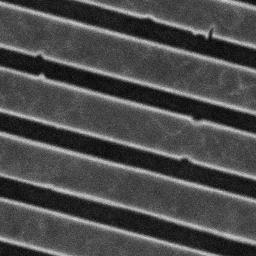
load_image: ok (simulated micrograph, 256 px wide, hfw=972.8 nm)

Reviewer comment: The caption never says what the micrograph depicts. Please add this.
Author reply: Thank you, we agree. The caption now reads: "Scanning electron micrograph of one or a few lines or trenches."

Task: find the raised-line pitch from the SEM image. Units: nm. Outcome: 238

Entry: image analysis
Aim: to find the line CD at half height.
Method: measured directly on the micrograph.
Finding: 156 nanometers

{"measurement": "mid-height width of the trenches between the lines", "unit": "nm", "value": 83.7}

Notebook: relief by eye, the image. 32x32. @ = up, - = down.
@-----------@@@@@@@@@@@@@@@@@@--
@@@@------------@@@@@@@@@@@@@@@@
@@@@@@@@-----------@@@@@@@@@@@@@
@@@@@@@@@@@@-----------@@@@@@@@@
@@@@@@@@@@@@@@@@-----------@@@@@
@@@@@@@@@@@@@@@@@@@-----------@@
---@@@@@@@@@@@@@@@@@@@@---------
------@@@@@@@@@@@@@@@@@@@@@-----
----------@@@@@@@@@@@@@@@@@@@@@-
@@@@----------@@@@@@@@@@@@@@@@@@
@@@@@@@@----------@@@@@@@@@@@@@@
@@@@@@@@@@@-----------@@@@@@@@@@
@@@@@@@@@@@@@@@-----------@@@@@@
@@@@@@@@@@@@@@@@@@@----------@@@
---@@@@@@@@@@@@@@@@@@@----------
------@@@@@@@@@@@@@@@@@@@@@-----
----------@@@@@@@@@@@@@@@@@@@@--
@@@-----------@@@@@@@@@@@@@@@@@@
@@@@@@@-----------@@@@@@@@@@@@@@
@@@@@@@@@@@----------@@@@@@@@@@@
@@@@@@@@@@@@@@-----------@@@@@@@
@@@@@@@@@@@@@@@@@@-----------@@@
---@@@@@@@@@@@@@@@@@@@----------
------@@@@@@@@@@@@@@@@@@@@------
----------@@@@@@@@@@@@@@@@@@@---
@@@-----------@@@@@@@@@@@@@@@@@@
@@@@@@------------@@@@@@@@@@@@@@
@@@@@@@@@@-----------@@@@@@@@@@@
@@@@@@@@@@@@@@-----------@@@@@@@
@@@@@@@@@@@@@@@@@@----------@@@@
--@@@@@@@@@@@@@@@@@@@-----------
------@@@@@@@@@@@@@@@@@@@-------